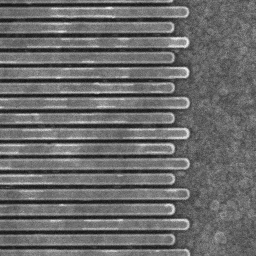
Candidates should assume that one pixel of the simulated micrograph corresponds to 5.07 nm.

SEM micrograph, parallel lines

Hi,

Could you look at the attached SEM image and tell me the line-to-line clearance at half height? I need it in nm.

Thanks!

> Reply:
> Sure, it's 29.1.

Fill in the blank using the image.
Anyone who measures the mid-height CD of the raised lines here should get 0.0481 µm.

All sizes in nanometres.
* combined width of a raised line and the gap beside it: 76.8